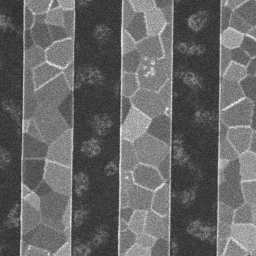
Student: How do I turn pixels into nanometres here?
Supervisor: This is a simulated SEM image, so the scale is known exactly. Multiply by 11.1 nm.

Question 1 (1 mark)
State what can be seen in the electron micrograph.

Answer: one or a few lines or trenches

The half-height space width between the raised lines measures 527 nanometers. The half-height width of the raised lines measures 50.4 pixels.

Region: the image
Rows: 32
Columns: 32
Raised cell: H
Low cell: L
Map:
LLLHHHHHHLLLLLLHHHHHHHLLLLLLHHHH
LLLHHHHHHLLLLLLHHHHHHHLLLLLLHHHH
LLLHHHHHHLLLLLLHHHHHHLLLLLLLHHHH
LLLHHHHHHLLLLLLHHHHHHLLLLLLLHHHH
LLLHHHHHHLLLLLLHHHHHHHLLLLLLHHHH
LLLHHHHHHLLLLLLHHHHHHHLLLLLLHHHH
LLLHHHHHHLLLLLLHHHHHHLLLLLLLHHHH
LLLHHHHHHLLLLLLHHHHHHHLLLLLLHHHH
LLLHHHHHHLLLLLLHHHHHHHLLLLLLHHHH
LLLHHHHHHLLLLLLHHHHHHLLLLLLLHHHH
LLLHHHHHHLLLLLLHHHHHHLLLLLLLHHHH
LLLHHHHHHLLLLLLHHHHHHLLLLLLLHHHH
LLLHHHHHHLLLLLLHHHHHHLLLLLLLHHHH
LLLHHHHHHLLLLLLHHHHHHLLLLLLLHHHH
LLLHHHHHHLLLLLLHHHHHHLLLLLLHHHHH
LLLHHHHHHLLLLLLHHHHHHLLLLLLHHHHH
LLLHHHHHHLLLLLLHHHHHHLLLLLLHHHHH
LLLHHHHHHLLLLLLHHHHHHLLLLLLHHHHH
LLLHHHHHHLLLLLLHHHHHHLLLLLLHHHHH
LLLHHHHHHLLLLLLHHHHHHLLLLLLHHHHH
LLLHHHHHHLLLLLLHHHHHHLLLLLLHHHHH
LLLHHHHHHLLLLLLHHHHHHLLLLLLHHHHH
LLLHHHHHHLLLLLLHHHHHHLLLLLLHHHHH
LLLHHHHHHLLLLLLHHHHHHLLLLLLHHHHH
LLLHHHHHHLLLLLLHHHHHHLLLLLLHHHHH
LLLHHHHHHLLLLLLHHHHHHLLLLLLHHHHH
LLLHHHHHHLLLLLLHHHHHHLLLLLLHHHHH
LLLHHHHHHLLLLLLHHHHHHLLLLLLHHHHH
LLLHHHHHHLLLLLLHHHHHHLLLLLLHHHHH
LLLHHHHHHLLLLLLHHHHHHLLLLLLHHHHH
LLLHHHHHHLLLLLLHHHHHHLLLLLLHHHHH
LLLHHHHHHLLLLLLHHHHHHLLLLLLHHHHH